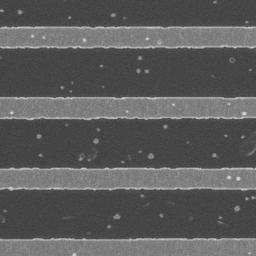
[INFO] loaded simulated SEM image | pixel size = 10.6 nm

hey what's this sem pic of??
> lines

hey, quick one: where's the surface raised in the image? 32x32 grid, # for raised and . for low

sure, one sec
................................
................................
................................
################################
################################
################################
................................
................................
................................
................................
................................
................................
################################
################################
################################
................................
................................
...............................#
...............................#
................................
................................
################################
################################
################################
................................
................................
................................
................................
................................
................................
################################
################################